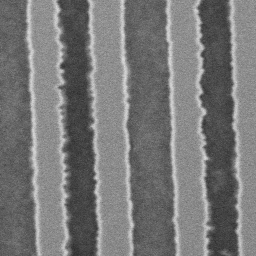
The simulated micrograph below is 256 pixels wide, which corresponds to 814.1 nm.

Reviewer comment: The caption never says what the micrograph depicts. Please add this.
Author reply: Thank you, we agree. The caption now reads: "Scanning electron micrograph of lines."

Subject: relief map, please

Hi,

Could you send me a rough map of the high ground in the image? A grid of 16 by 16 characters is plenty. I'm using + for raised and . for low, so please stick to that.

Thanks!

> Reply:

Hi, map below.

..++..++..++..++
..++..++..++..++
..++..++..+++.++
..++..++...++.++
..++..++...++..+
..++..++...++..+
..++..++...++..+
..++..++...++..+
..++..++...++..+
..++..++...++..+
..++..++...++..+
..++..++...++..+
..++..++...++..+
..++..++...++..+
..++..++...++..+
..++..++...++..+